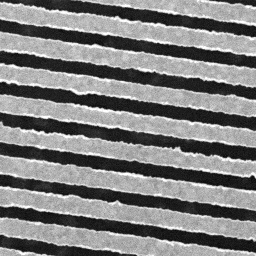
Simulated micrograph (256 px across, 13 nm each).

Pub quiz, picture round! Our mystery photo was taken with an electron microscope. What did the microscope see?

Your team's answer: parallel lines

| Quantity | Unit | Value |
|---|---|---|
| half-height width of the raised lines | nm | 222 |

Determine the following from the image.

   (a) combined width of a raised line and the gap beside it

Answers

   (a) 397 nm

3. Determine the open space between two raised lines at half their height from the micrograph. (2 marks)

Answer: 171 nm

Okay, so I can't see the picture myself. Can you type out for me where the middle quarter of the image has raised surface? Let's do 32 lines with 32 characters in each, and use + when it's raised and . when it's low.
............++++++++++++++++++++
...................+++++++++++++
+.........................++++++
+++++++++.......................
+++++++++++++++.................
++++++++++++++++++++++..........
.+++++++++++++++++++++++++++++..
...+++..++++++++++++++++++++++++
...............+++++++++++++++++
......................++++++++++
++++........................++++
+++++++++++.....................
++++++++++++++++++..............
+++++++++++++++++++++++++.......
...++++++++++++++++++++++++++++.
.........+++++++++++++++++++++++
................++++++++++++++++
........................++++++++
++++++.......................+++
++++++++++++....................
++++++++++++++++++++............
+++++++++++++++++++++++++++++...
.....+++++++++++++++++++++++++++
............++++++++++++++++++++
...................+++++++++++++
+++........................+++++
+++++++++.......................
++++++++++++++++++..............
++++++++++++++++++++++++........
+++++++++++++++++++++++++++++++.
......++++++++++++++++++++++++++
............++++++++++++++++++++